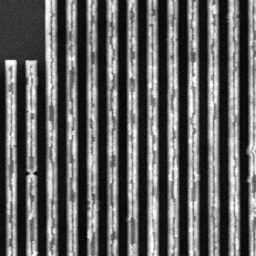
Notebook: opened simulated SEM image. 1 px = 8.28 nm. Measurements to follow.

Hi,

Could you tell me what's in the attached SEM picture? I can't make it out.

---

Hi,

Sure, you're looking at parallel lines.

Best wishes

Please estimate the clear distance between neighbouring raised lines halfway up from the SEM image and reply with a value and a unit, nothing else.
97.3 nm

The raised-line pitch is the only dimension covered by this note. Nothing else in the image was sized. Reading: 168 nm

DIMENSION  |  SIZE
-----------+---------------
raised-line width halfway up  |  73.5 nm